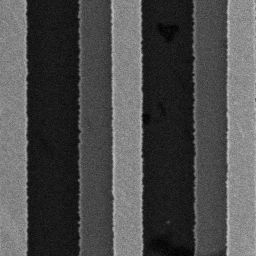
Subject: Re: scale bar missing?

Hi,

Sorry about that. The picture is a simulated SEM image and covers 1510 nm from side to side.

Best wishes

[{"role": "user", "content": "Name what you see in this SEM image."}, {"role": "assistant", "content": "lines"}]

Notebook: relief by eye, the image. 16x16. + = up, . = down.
++...++++...++++
++...++++...++++
++...++++...++++
++...++++...++++
++...++++...++++
++...++++...++++
++...++++...++++
++...++++...++++
++...++++...++++
++...++++...++++
++...++++...++++
++...++++...++++
++...++++...++++
++...++++...++++
++...++++...++++
++...++++...++++